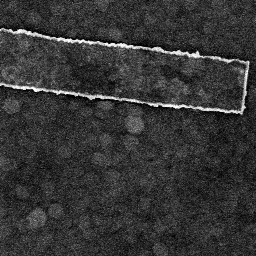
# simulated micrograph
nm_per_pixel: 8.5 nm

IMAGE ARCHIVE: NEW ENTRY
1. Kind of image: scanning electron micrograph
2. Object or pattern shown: one or a few lines or trenches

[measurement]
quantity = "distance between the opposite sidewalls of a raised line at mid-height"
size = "471 nm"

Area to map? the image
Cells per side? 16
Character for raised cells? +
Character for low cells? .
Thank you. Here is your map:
................
................
++++............
+++++++++++++...
+++++++++++++++.
.++++++++++++++.
.........++++++.
................
................
................
................
................
................
..+.............
................
................